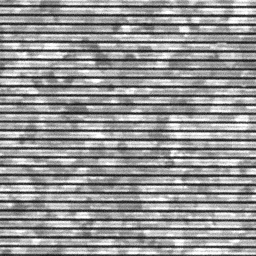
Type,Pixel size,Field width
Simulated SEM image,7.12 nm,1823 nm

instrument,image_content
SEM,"parallel lines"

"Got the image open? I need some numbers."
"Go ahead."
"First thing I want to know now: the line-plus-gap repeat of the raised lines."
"8.88 pixels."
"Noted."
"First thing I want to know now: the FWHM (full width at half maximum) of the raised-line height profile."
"39.1 nm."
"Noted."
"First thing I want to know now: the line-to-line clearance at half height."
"0.0258 um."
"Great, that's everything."